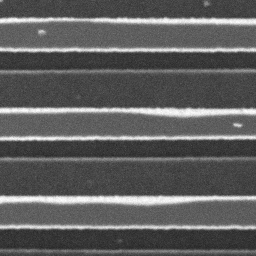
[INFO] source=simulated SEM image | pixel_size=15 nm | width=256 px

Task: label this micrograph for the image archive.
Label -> lines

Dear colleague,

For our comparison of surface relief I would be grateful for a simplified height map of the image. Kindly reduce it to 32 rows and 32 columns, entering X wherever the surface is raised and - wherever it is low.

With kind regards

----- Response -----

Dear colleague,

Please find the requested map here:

--------------------------------
--------------------------------
XXXXXXXXXXXXXXXXXXXXXXXXXXXXXX--
XXXXXXXXXXXXXXXXXXXXXXXXXXXXXXXX
XXXXXXXXXXXXXXXXXXXXXXXXXXXXXXXX
XXXXXXXXXXXXXXXXXXXXXXXXXXXXXXXX
--------------------------------
--------------------------------
--------------------------------
--------------------------------
--------------------------------
--------------------------------
--------------------------------
--------------------------------
XXXXXXXXXXXXXXXXXXXXXXXXXXXXXXXX
XXXXXXXXXXXXXXXXXXXXXXXXXXXXXXXX
XXXXXXXXXXXXXXXXXXXXXXXXXXXXXXXX
--------------------------------
--------------------------------
--------------------------------
--------------------------------
--------------------------------
--------------------------------
--------------------------------
--------------------------------
XXXXXXXXXXXXXXXXXXXXXXXXXXXXXXXX
XXXXXXXXXXXXXXXXXXXXXXXXXXXXXXXX
XXXXXXXXXXXXXXXXXXXXXXXXXXXXXXXX
XXXXXXXXXXXXXXXXXXXXXXXXXXXXXXXX
--------------------------------
--------------------------------
--------------------------------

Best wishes